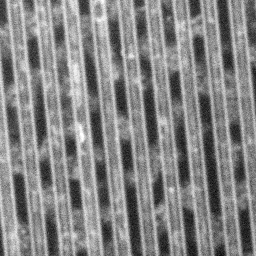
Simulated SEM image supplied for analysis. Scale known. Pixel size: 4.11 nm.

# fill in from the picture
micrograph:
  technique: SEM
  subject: parallel lines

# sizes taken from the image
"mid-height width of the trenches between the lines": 46.5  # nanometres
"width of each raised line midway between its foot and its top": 65.9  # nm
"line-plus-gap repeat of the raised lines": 113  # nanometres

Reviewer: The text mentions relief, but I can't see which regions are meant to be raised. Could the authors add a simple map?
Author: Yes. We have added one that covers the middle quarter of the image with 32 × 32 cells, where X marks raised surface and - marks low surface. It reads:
XX---XXX---XXXX----XXX---XXXX---
XX---XXXX---XXX----XXX----XXX---
XX---XXXX---XXXX---XXX----XXX---
XX---XXXX---XXXX---XXX----XXXX--
XX---XXXX---XXXX---XXXX---XXXX--
XX---XXXX---XXXX---XXXX---XXXX--
XX---XXXX---XXXX---XXXX---XXXX--
XX---XXXX---XXXX---XXXX---XXXX--
XX---XXXX---XXXX---XXXX---XXXX--
XXX---XXX---XXXX---XXXX---XXXX--
XXX---XXX----XXX----XXX---XXXX--
XXX---XXXX---XXX----XXX----XXX--
XXX---XXXX---XXXX---XXX----XXXX-
XXX---XXXX---XXXX---XXXX---XXXX-
XXX---XXXX---XXXX---XXXX---XXXX-
XXX---XXXX---XXXX---XXXX---XXXX-
XXX---XXXX---XXXX---XXXX---XXXX-
XXX---XXXX---XXXX---XXXX---XXXX-
XXX---XXXX---XXXX---XXXX---XXXX-
XXXX---XXX---XXXX----XXX---XXXX-
XXXX---XXXX---XXX----XXX---XXXX-
XXXX---XXXX---XXX----XXX----XXX-
XXXX---XXXX---XXXX---XXX----XXXX
XXXX---XXXX---XXXX---XXXX---XXXX
XXXX---XXXX---XXXX---XXXX---XXXX
XXXX---XXXX---XXXX---XXXX---XXXX
XXXX---XXXX---XXXX---XXXX---XXXX
-XXX---XXXX---XXXX---XXXX---XXXX
-XXX---XXXX---XXXX---XXXX---XXXX
-XXXX---XXX---XXXX---XXXX---XXXX
-XXXX---XXXX---XXX---XXXX----XXX
-XXXX---XXXX---XXX----XXX----XXX